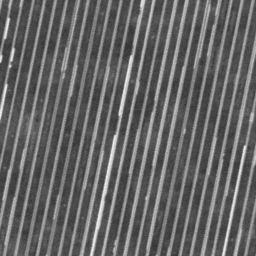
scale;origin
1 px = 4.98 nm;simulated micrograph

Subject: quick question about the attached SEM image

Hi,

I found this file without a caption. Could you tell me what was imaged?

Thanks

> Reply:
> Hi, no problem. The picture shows parallel lines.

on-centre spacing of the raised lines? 53.6 nm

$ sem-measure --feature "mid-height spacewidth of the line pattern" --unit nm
44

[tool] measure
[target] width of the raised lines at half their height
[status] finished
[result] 12.8 nm